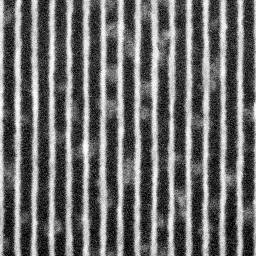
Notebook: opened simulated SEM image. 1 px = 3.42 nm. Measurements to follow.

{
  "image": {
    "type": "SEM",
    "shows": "parallel lines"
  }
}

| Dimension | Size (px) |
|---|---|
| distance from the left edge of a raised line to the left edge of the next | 17.1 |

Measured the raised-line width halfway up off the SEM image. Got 12 nm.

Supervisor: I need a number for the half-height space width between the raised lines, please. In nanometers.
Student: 46.6